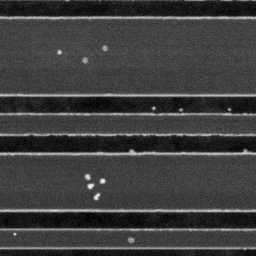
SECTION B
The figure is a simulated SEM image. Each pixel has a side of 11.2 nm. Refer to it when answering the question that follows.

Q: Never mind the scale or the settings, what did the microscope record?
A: lines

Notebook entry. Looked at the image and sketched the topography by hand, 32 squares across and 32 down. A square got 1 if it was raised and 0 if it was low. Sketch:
00000000000000000000000000000000
00000000000000000000000000000000
11111111111111111111111111111111
11111111111111111111111111111111
11111111111111111111111111111111
11111111111111111111111111111111
11111111111111111111111111111111
11111111111111111111111111111111
11111111111111111111111111111111
11111111111111111111111111111111
11111111111111111111111111111111
11111111111111111111111111111111
00000000000000000000000000000000
00000000000000000000000000000000
11111111111111111111111111111111
11111111111111111111111111111111
11111111111111111111111111111111
00000000000000000000000000000000
00000000000000000000000000000000
11111111111111111111111111111111
11111111111111111111111111111111
11111111111111111111111111111111
11111111111111111111111111111111
11111111111111111111111111111111
11111111111111111111111111111111
11111111111111111111111111111111
00000000000000000000000000000000
00000000000000000000000000000000
00000000000000000000000000000000
11111111111111111111111111111111
11111111111111111111111111111111
00000000000000000000000000000000